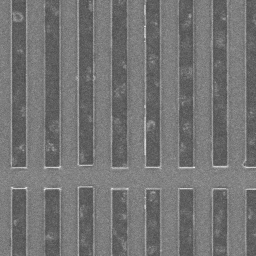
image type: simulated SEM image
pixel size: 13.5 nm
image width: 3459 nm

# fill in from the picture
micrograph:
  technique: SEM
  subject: parallel lines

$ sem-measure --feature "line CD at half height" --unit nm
203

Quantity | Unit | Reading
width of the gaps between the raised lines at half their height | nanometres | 243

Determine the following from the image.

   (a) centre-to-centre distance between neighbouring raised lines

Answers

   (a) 452 nm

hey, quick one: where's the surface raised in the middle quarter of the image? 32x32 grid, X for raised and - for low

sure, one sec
----XXX-----XXXX-----XXX-----XXX
----XXX-----XXXX-----XXX-----XXX
----XXX-----XXXX-----XXX-----XXX
----XXXX----XXXX-----XXX-----XXX
----XXX-----XXXX-----XXX-----XXX
----XXX-----XXXX-----XXX-----XXX
----XXX-----XXXX-----XXX-----XXX
----XXX-----XXXX-----XXX-----XXX
----XXX-----XXXX-----XXX-----XXX
----XXX-----XXXX-----XXX-----XXX
----XXX-----XXXX-----XXX-----XXX
----XXX-----XXXX-----XXX-----XXX
----XXX-----XXXX-----XXX-----XXX
----XXX-----XXXX-----XXX-----XXX
----XXX-----XXXX-----XXX-----XXX
----XXX-----XXXX------XX-----XXX
----XXX-----XXXX-----XXX-----XXX
----XXX-----XXXX-----XXX-----XXX
----XXX-----XXXX-----XXX-----XXX
----XXX-----XXXX-----XXX-----XXX
----XXX-----XXXX-----XXX-----XXX
----XXX-----XXXX-----XXX-----XXX
----XXX-----XXXX-----XXX-----XXX
----XXX-----XXXX-----XXX-----XXX
----XXX-----XXXX-----XXX-----XXX
------------XXXX-----XXX-----XXX
--------------------------------
--------------------------------
--------------------------------
--------------------------------
--------------------------------
----XXX-----XXXX-----XXX-----XXX